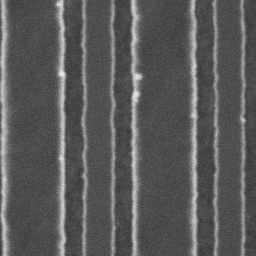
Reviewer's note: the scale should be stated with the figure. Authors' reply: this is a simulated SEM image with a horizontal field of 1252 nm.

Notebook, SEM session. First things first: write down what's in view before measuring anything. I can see lines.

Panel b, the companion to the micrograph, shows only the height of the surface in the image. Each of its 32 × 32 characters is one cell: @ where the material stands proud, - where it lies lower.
@@@@@@@@--@@@@---@@@@@@@---@@@--
@@@@@@@@--@@@@---@@@@@@@---@@@--
@@@@@@@@--@@@@---@@@@@@@---@@@--
@@@@@@@@--@@@@---@@@@@@@---@@@--
@@@@@@@@--@@@@---@@@@@@@---@@@@-
@@@@@@@@--@@@@---@@@@@@@---@@@--
@@@@@@@@--@@@@---@@@@@@@---@@@--
@@@@@@@@--@@@@---@@@@@@@---@@@--
@@@@@@@@--@@@@---@@@@@@@---@@@--
@@@@@@@@--@@@@---@@@@@@@---@@@--
@@@@@@@@--@@@@---@@@@@@@---@@@@-
@@@@@@@@---@@@---@@@@@@@---@@@--
@@@@@@@@---@@@---@@@@@@@---@@@--
@@@@@@@@---@@@---@@@@@@@---@@@--
@@@@@@@@--@@@@---@@@@@@@---@@@--
@@@@@@@@--@@@@---@@@@@@@---@@@@-
@@@@@@@@--@@@@---@@@@@@@---@@@--
@@@@@@@@---@@@---@@@@@@@---@@@--
@@@@@@@@---@@@---@@@@@@@---@@@--
@@@@@@@@--@@@@---@@@@@@@---@@@--
@@@@@@@@---@@@---@@@@@@@---@@@--
@@@@@@@@---@@@---@@@@@@@---@@@--
@@@@@@@@---@@@---@@@@@@@---@@@--
@@@@@@@@---@@@---@@@@@@@---@@@--
@@@@@@@@--@@@@---@@@@@@@---@@@--
@@@@@@@@---@@@---@@@@@@@---@@@--
@@@@@@@@---@@@---@@@@@@@---@@@--
@@@@@@@@--@@@@---@@@@@@@---@@@--
@@@@@@@@--@@@@---@@@@@@@---@@@--
@@@@@@@@--@@@@---@@@@@@@---@@@@-
@@@@@@@@--@@@@---@@@@@@@---@@@--
-@@@@@@@--@@@@---@@@@@@@---@@@--